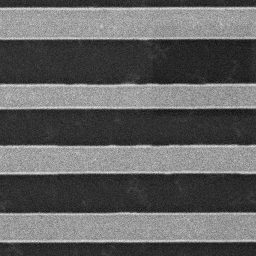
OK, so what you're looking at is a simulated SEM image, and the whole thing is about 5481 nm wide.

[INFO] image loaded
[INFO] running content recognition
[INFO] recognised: one or a few lines or trenches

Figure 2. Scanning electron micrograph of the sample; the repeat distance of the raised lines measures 1460 nm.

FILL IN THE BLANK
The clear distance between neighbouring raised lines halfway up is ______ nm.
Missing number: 880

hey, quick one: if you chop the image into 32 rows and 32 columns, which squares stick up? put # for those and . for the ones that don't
................................
################################
################################
################################
################################
................................
................................
................................
................................
................................
................................
################################
################################
................................
................................
................................
................................
................................
################################
################################
################################
###########.###########.##......
................................
................................
................................
................................
................................
################################
################################
################################
................................
................................